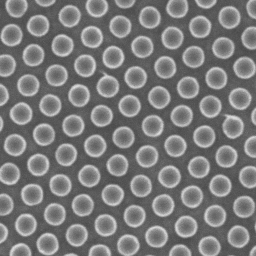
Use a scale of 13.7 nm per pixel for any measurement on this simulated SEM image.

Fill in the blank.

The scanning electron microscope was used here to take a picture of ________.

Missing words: a regular array of raised bodies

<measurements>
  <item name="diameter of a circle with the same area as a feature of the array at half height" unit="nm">285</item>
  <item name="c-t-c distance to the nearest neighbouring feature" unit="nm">404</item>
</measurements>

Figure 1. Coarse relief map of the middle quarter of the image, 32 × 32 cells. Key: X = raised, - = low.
---XXXXX---XX----------XXXXX---X
---XXXX---------XXXX---XXXXX----
X---XXX---------XXXX---XXXX-----
X---------XX---XXXXX-----X----XX
---------XXXX---XXXX---------XXX
---XX---XXXXXX---XX----------XXX
--XXXX---XXXX---------XXX----XXX
-XXXXX---XXXX--------XXXXX---XXX
-XXXXX---------XXX---XXXXX------
--XXXX--------XXXXX---XXXX------
---------X----XXXXX----XX----X--
-------XXXX---XXXXX---------XXXX
-------XXXXX---XXX---------XXXXX
-XXX---XXXXX---------XXX---XXXXX
XXXXX--XXXX---------XXXX---XXXXX
XXXXX---------------XXXXX----X--
XXXXX--------XXXX---XXXX--------
-XXX--------XXXXX---XXXX--------
------XXX---XXXXX---------XXX---
------XXXX---XXXX---------XXXX--
XX---XXXXX----XX---------XXXXX--
XXX--XXXXX---------XXXX---XXXX--
XXX---XXX---------XXXXX---XXX---
XXX---------XXX---XXXXX---------
XX---------XXXXX---XXXX---------
------X----XXXXX----X----------X
----XXXX---XXXXX--------XXXX---X
----XXXXX---XXX---------XXXXX---
X---XXXXX---------XXX---XXXXX---
X---XXXX---------XXXX---XXXXX---
XX---------XX----XXXXX---XX-----
X---------XXXX---XXXXX--------XX